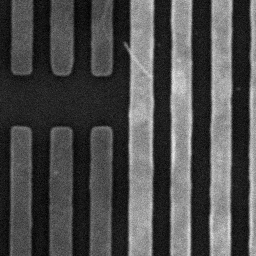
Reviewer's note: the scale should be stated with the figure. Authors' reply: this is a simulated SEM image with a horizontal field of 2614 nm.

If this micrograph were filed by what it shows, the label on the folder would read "wiring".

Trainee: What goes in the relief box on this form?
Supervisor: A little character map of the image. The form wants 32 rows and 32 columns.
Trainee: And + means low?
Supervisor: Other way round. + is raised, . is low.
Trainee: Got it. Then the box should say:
..++...++...++..+++...++...++...
..++..+++...++..+++...++...++..+
..++..+++...++..+++...++..+++...
..++..+++...++..+++...++..+++...
..++..+++...++..+++...++..+++...
..++..+++...++..+++...++..+++...
..++..+++...++..+++...++..+++..+
..++..+++...++..+++...++...++..+
..++...++..+++..+++...++...++..+
................+++...++...++..+
................+++...++..+++..+
................+++...++...++..+
................+++..+++...++..+
................+++...++...++..+
................+++...++..+++..+
................+++...++..+++..+
..++..+++..+++..+++...++..+++..+
..++..+++..+++..+++...++..+++..+
..++..+++..+++..+++...++..+++..+
..++..+++..+++..+++...++..+++..+
..++..+++..+++..+++...++..+++..+
..++..+++..+++..+++..+++...++..+
..++..+++..+++..+++..+++..+++..+
..++..+++..+++..+++..+++..+++..+
..++..+++..+++..+++..+++..+++..+
..++..+++..+++..+++..+++..+++..+
.+++..+++..+++..+++..+++..+++..+
.+++..+++..+++..+++..+++..+++..+
.+++..+++..+++..+++..+++..+++..+
.+++..+++..+++..+++..+++..+++..+
.+++..+++..+++..+++..+++..+++..+
.+++..+++..+++..+++..+++..+++..+